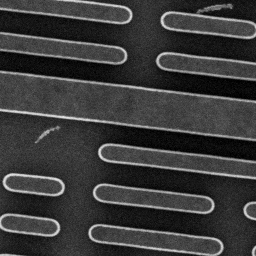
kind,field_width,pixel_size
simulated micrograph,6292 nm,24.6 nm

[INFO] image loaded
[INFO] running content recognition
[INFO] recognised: groups of lines, slits or small figures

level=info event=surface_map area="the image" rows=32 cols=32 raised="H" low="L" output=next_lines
HHHHHHHHHHHHHLLLLLLLLLLLLLLLLLLL
LLLLHHHHHHHHHHHHLLLLLLLLLLLLLLLL
LLLLLLLLLLLHHHHHLLLLHHHHHHHHHLLL
LLLLLLLLLLLLLLLLLLLLLHHHHHHHHHHH
HHHLLLLLLLLLLLLLLLLLLLLLLLLLLHHH
HHHHHHHHHHHLLLLLLLLLLLLLLLLLLLLL
LLHHHHHHHHHHHHHHLLLLLLLLLLLLLLLL
LLLLLLLLLLLHHHHHLLLLHHHHHHHHLLLL
LLLLLLLLLLLLLLLLLLLLHHHHHHHHHHHH
HHHHHLLLLLLLLLLLLLLLLLLLLLLHHHHH
HHHHHHHHHHHHHLLLLLLLLLLLLLLLLLLL
HHHHHHHHHHHHHHHHHHHHHHLLLLLLLLLL
HHHHHHHHHHHHHHHHHHHHHHHHHHHHHHHL
HHHHHHHHHHHHHHHHHHHHHHHHHHHHHHHH
LLLLLLHHHHHHHHHHHHHHHHHHHHHHHHHH
LLLLLLLLLLLLLLLHHHHHHHHHHHHHHHHH
LLLLLLLLLLLLLLLLLLLLLLLHHHHHHHHH
LLLLLLLLLLLLLLLLLLLLLLLLLLLLLLLH
LLLLLLLLLLLLLHHHHHLLLLLLLLLLLLLL
LLLLLLLLLLLLLHHHHHHHHHHHHHLLLLLL
LLLLLLLLLLLLLLLLHHHHHHHHHHHHHHHH
LLLLLLLLLLLLLLLLLLLLLLLLLHHHHHHH
LHHHHHHLLLLLLLLLLLLLLLLLLLLLLLLL
LHHHHHHHLLLLHHHHLLLLLLLLLLLLLLLL
LLLLLLLLLLLLHHHHHHHHHHHHHLLLLLLL
LLLLLLLLLLLLLLLHHHHHHHHHHHHLLLLH
LLLLLLLLLLLLLLLLLLLLLLLLHHLLLLLH
HHHHHHHLLLLLLLLLLLLLLLLLLLLLLLLL
HHHHHHHLLLLLHHHLLLLLLLLLLLLLLLLL
LLLLLLLLLLLHHHHHHHHHHHHHLLLLLLLL
LLLLLLLLLLLLLLLHHHHHHHHHHHHHLLLL
LLLLLLLLLLLLLLLLLLLLLLLHHHHLLLLL